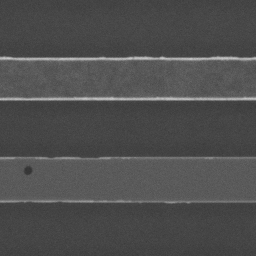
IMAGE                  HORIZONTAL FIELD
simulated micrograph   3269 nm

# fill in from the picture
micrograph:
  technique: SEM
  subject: lines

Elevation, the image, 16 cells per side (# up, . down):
................
................
................
................
################
################
................
................
................
................
################
################
################
................
................
................